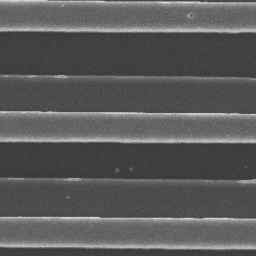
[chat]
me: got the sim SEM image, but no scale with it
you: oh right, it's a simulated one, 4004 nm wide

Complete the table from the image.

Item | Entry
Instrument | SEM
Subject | lines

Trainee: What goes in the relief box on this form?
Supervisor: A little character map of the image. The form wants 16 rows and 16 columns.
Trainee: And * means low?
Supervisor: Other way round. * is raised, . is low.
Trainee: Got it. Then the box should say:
****************
****************
................
................
................
****************
****************
****************
****************
................
................
****************
****************
****************
****************
.........*******